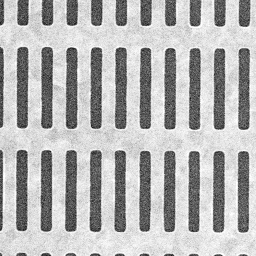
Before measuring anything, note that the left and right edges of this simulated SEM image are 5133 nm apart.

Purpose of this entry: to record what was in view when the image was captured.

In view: groups of lines, slits or small figures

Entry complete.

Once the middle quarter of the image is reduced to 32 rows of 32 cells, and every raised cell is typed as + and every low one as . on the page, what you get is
....++....+++...+++...+++...+++.
....++....+++...+++...+++...+++.
....++....+++...+++...+++...+++.
....++....+++...+++...+++...+++.
....++....+++...+++...+++...+++.
....++....+++...+++...+++...+++.
....++....+++...+++...+++...+++.
....++....+++...+++...+++...+++.
....++....+++...+++...+++...+++.
....++....+++...+++...+++...+++.
....++....+++...+++...+++...+++.
....++....+++...+++...+++...+++.
....++....++....+++...+++...+++.
....++....++....+++...+++...+++.
....++....++....+++...+++...+++.
...++++..++++...+++...+++...+++.
++++++++++++++++++++++++++.+++++
++++++++++++++++++++++++++++++++
++++++++++++++++++++++++++++++++
++++++++++++++++++++++++++++++++
++++++++++++++++++++++++++++++++
+..++++..++++..+++++.+++++.+++++
...+++....+++...+++...+++...+++.
....++....++....+++...+++...+++.
....++....++....+++...+++...+++.
....++....++....+++...+++...+++.
...+++....++....+++...+++...+++.
...+++....++....+++...+++...+++.
...+++....++....+++...+++...+++.
...+++....++....+++...+++...+++.
...+++....++....+++...+++...+++.
...+++....++....+++...+++...+++.